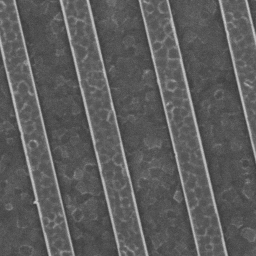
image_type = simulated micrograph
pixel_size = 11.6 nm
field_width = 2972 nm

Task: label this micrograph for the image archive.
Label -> one or a few lines or trenches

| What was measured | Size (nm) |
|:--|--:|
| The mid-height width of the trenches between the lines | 578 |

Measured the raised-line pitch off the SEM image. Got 863 nanometers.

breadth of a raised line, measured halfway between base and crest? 320 nanometers